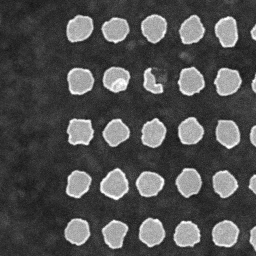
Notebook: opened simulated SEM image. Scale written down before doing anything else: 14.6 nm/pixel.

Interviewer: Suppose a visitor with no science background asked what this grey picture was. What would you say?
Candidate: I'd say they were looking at a regular array of raised bodies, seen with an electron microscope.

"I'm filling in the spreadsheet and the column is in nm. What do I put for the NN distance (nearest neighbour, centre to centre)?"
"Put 525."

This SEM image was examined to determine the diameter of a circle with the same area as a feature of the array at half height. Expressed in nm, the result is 370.